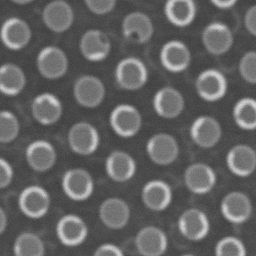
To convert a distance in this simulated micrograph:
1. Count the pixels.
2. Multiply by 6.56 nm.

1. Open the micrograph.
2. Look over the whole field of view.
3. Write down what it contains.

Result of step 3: a regular array of raised bodies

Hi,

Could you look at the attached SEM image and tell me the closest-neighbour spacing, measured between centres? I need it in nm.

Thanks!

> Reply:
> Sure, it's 301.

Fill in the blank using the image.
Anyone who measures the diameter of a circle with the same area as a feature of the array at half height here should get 190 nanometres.